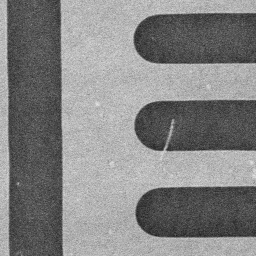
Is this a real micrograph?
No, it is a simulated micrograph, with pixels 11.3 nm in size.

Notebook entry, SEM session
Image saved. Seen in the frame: groups of lines, slits or small figures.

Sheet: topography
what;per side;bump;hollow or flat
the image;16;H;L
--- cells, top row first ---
LLLLHHHHHHHHHHHH
LLLLHHHHHLLLLLLL
LLLLHHHHLLLLLLLL
LLLLHHHHHLLLLLLL
LLLLHHHHHHHHHHHH
LLLLHHHHHHHHHHHH
LLLLHHHHHLLLLLLL
LLLLHHHHLLLLLLLL
HLLLHHHHHLLLLLLL
HLLLHHHHHHHHHHHH
HLLLHHHHHHHHHHHH
HLLLHHHHHHHHHHHH
HLLLHHHHHLLLLLLL
HLLLHHHHHLLLLLLL
HLLLHHHHHLLLLLLL
HLLLHHHHHHHHHHHH